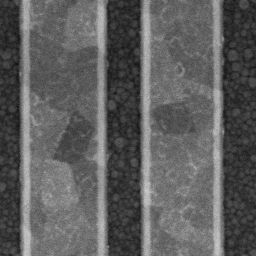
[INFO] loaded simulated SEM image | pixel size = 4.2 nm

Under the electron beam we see one or a few lines or trenches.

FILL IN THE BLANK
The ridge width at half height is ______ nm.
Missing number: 308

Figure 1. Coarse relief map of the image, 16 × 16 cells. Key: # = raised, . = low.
..####...#####..
..####...#####..
..####...#####..
..####...#####..
..####...#####..
..####...#####..
..####...#####..
..####...#####..
..####...#####..
..####...#####..
..####...#####..
..####...#####..
..####...#####..
..####...#####..
..####...#####..
..####...#####..